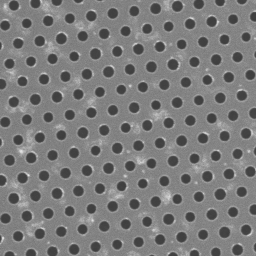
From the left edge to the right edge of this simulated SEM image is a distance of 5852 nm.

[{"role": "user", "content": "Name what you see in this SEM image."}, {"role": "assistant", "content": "a regular array of holes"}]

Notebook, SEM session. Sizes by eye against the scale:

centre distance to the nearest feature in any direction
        0.492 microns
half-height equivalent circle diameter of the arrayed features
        245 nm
